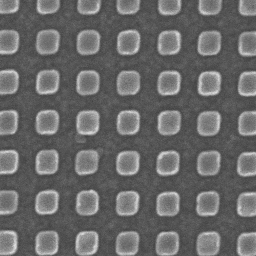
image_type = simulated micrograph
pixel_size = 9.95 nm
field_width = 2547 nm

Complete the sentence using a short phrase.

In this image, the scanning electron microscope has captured a regular array of raised bodies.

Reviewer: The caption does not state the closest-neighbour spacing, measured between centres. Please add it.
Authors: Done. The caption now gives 39.9 px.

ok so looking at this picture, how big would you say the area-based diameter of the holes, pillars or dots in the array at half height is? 249 nm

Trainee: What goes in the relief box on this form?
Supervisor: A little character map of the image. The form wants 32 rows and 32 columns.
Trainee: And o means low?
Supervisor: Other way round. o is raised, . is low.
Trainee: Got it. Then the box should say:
oo...oo...oo...oo...ooo..ooo..oo
oo...oo...oo...oo...oo...oo...oo
................................
................................
oo...oo...oo...oo...ooo..ooo..oo
oo...oo...oo...oo...ooo..ooo..oo
oo...oo...oo...oo...oo...oo...oo
................................
................................
oo...oo...oo...oo...oo...ooo..oo
oo...oo...oo...oo...oo...ooo..oo
oo...oo...oo...oo...oo...oo...oo
................................
................................
oo...oo...oo...oo...oo...oo...oo
oo...oo...oo...oo...oo...oo...oo
oo...oo...oo...oo...oo...oo...oo
................................
................................
oo...oo...oo...oo...oo...oo...oo
oo..ooo...oo...oo...oo...oo...oo
oo...oo...oo...oo...oo...oo...oo
................................
................................
oo...oo...oo...oo...oo...oo...oo
oo...oo...oo...oo...oo...oo...oo
oo...oo...oo...oo...oo...oo...oo
................................
................................
oo...oo...oo...oo...oo...oo...oo
oo...oo...oo...oo...oo...oo...oo
oo...oo...oo...oo...oo...oo...oo